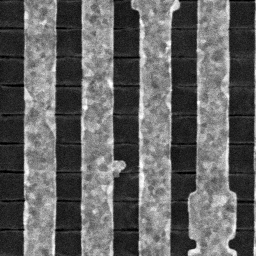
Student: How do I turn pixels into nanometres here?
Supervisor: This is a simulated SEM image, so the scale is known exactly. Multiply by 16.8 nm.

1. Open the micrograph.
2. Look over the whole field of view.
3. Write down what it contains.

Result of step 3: wiring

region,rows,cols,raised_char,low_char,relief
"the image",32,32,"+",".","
...++++...++++...+++++...+++....
...++++...++++...++++....+++....
...++++...++++....+++....+++....
...++++...++++....+++....+++....
...++++...++++....+++....+++....
...++++...++++....+++....+++....
...++++....+++....+++....+++....
...++++....+++....+++....++++...
...++++....+++....+++....++++...
...++++....+++....+++....+++....
...++++....+++....+++....+++....
...++++....+++....+++....+++....
...++++....+++....+++....++++...
...++++....+++....+++....+++....
...+++....++++....+++....+++....
...++++...++++...++++....++++...
...++++...++++...++++....+++....
...++++...++++....+++....+++....
...++++...++++....+++....+++....
...++++...++++....+++....+++....
...++++...+++++...+++....+++....
...++++...+++++...+++....+++....
...++++...++++....+++....+++....
...++++...++++....+++....+++....
...++++...++++....+++...+++++...
...++++...++++...++++...+++++...
...++++...++++...++++...+++++...
...++++....+++...++++...+++++...
...++++...++++...++++...+++++...
...++++...++++...++++...+++++...
...++++...++++...++++....+++....
...++++...++++...++++...+++++...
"